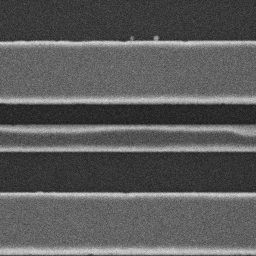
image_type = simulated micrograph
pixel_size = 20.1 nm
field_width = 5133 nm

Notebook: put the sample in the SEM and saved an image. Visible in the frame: lines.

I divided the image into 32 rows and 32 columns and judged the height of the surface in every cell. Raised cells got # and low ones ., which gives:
................................
................................
................................
................................
................................
################################
################################
################################
################################
################################
################################
################################
################################
................................
................................
................................
################################
################################
################################
................................
................................
................................
................................
................................
################################
################################
################################
################################
################################
################################
################################
################################